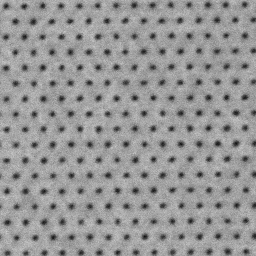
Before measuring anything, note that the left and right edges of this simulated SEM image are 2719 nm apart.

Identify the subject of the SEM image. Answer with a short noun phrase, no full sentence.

a regular array of holes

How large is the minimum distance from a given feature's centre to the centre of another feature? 0.187 microns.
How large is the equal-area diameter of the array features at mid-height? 6.28 pixels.